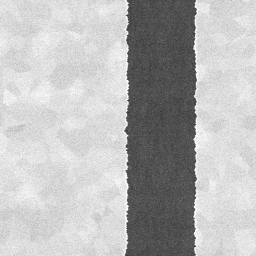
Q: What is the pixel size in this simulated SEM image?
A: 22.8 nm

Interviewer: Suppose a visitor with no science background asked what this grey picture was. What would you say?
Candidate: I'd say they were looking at one or a few lines or trenches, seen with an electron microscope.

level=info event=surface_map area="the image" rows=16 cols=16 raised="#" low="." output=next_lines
########....####
########....####
########....####
########....####
########....####
########....####
########....####
########....####
########....####
########....####
########....####
########....####
########....####
########....####
########....####
########....####